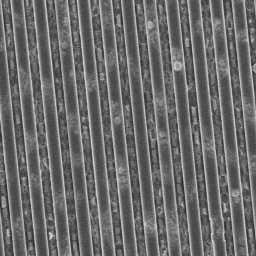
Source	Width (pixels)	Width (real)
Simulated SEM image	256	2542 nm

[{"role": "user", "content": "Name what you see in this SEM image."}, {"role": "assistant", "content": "parallel lines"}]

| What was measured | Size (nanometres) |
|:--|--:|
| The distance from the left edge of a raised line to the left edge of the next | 218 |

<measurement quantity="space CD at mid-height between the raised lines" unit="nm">93.8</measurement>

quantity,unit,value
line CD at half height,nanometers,122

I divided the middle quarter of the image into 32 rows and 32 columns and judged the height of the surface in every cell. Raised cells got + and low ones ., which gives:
+++..+++..++++..+++...+++..+++..
+++..+++...+++..+++...+++..+++..
+++..+++...+++..+++...+++..+++..
+++..+++...+++..+++...+++..+++..
+++..+++...+++..+++...+++..++++.
+++...++...+++..++++..+++...+++.
+++...+++..+++...+++..+++...+++.
+++...+++..+++...+++..+++...+++.
+++...+++..+++...+++..+++...+++.
+++...+++..+++...+++...++...+++.
++++..+++...++...+++...+++..+++.
++++..+++...+++..+++...+++..+++.
.+++..+++...+++..+++...+++..+++.
.+++..+++...+++..+++...+++..+++.
.+++..+++...+++..+++...+++..++++
.+++...++...+++..++++..+++...+++
.+++...+++..+++...+++..+++...+++
.+++...+++..+++...+++..+++...+++
.+++...+++..+++...+++..+++...+++
.+++...+++..+++...+++...++...+++
.++++..+++...++...+++...+++..+++
.++++..+++...+++..+++...+++..+++
..+++..+++...+++..+++...+++..+++
..+++..+++...+++..+++...+++..+++
..+++..+++...+++..+++...+++..+++
..+++...++...+++..++++..+++...++
..+++...+++..+++...+++..+++...++
..+++...+++..+++...+++..+++...++
..+++...+++..+++...+++..+++...++
..+++...+++..++++..+++...++...++
..++++..+++...+++..+++...+++..++
...+++..+++...+++..+++...+++..++